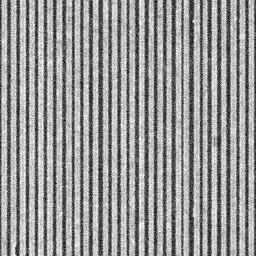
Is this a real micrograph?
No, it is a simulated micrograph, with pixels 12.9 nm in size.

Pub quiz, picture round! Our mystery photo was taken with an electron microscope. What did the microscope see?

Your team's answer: parallel lines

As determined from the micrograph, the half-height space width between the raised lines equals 4.75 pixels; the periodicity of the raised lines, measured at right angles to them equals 118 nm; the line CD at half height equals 53.2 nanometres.